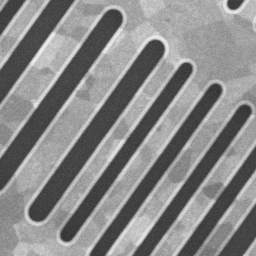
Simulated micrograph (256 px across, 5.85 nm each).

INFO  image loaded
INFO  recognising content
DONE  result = groups of lines, slits or small figures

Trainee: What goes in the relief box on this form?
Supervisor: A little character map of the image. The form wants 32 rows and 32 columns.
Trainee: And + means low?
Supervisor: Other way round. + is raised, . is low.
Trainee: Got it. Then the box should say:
...+++...+++++++++++++++++++..++
..+++....++++..+++++++++++++++++
..++....++++....++++++++++++++++
.+++...+++++...+++++++++++++++++
+++...+++++...++++++++++++++++++
++....++++....++++...+++++++++++
+....++++....++++....+++++++++++
+...+++++...+++++...++++++++++++
....++++....++++....++..++++++++
...++++....++++....++...++++++++
..++++....++++....+++..+++..++++
.+++++...+++++...+++...++...++++
.++++....++++....++...+++..+++++
++++....++++....++...+++...+++..
++++...+++++...+++..+++...+++..+
+++...+++++....++...+++..+++...+
++....++++....++...+++..+++...++
+....++++....+++..+++...+++..+++
+...+++++...+++...++...+++...+++
....++++....++...+++..+++...+++.
...++++....++...+++...++...+++..
..+++++...+++..+++...+++..+++...
.+++++...+++...+++..+++...+++..+
.++++....++...+++..+++...+++...+
++++....+++..+++...+++..+++...++
++++...+++..+++...+++...++...+++
+++....++...+++..+++...+++..+++.
++++..++...+++...++...+++...++..
++++++++..+++...+++..+++...+++..
+++++++...+++..+++...+++..+++...
++++++++++++..+++...+++...++....
+++++++++++...+++..+++...++....+